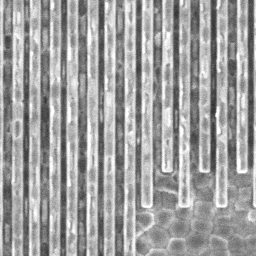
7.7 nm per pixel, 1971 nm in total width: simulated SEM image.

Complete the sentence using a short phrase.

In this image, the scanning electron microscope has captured parallel lines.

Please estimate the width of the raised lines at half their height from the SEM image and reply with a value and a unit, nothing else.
79.9 nanometres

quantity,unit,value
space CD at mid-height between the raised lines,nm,72.2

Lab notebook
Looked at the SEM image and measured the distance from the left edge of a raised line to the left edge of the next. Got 144 nm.